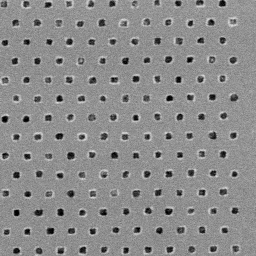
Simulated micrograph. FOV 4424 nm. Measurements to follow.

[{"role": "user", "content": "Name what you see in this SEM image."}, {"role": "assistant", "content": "a regular array of holes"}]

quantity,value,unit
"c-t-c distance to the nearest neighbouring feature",0.365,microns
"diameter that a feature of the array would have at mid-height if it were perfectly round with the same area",131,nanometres